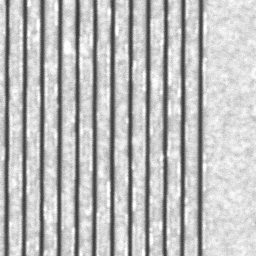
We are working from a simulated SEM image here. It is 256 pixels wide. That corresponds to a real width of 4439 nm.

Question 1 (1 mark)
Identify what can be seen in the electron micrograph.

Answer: parallel lines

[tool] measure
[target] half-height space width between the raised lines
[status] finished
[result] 0.0824 um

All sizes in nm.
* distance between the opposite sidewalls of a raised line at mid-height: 215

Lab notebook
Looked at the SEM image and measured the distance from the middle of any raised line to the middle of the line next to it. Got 0.305 microns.